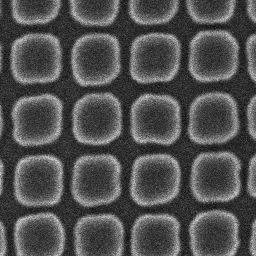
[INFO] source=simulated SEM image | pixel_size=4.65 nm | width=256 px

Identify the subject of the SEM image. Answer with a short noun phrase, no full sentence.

a regular array of raised bodies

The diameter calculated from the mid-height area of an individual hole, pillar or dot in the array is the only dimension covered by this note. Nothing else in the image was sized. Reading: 0.234 micrometres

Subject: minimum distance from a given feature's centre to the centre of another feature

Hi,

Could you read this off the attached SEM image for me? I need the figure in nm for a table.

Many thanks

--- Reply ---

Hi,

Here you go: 272